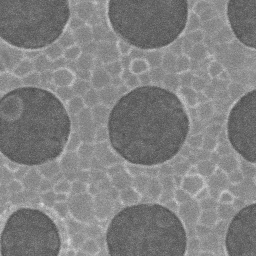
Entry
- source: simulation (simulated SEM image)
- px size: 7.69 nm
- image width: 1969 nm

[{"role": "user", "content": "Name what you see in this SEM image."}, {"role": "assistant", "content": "holes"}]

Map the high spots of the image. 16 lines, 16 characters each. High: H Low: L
LLLLHHHLLLLLHHLL
LLLLHHHLLLLLHHLL
LLLHHHHHLLLHHHHL
HHHHHHHHHHHHHHHH
HHHHHHHHHHHHHHHH
HLHHHHHHHLHHHHHH
LLLLHHHLLLLHHHHL
LLLLHHHLLLLLHHLL
LLLLHHHLLLLLHHLL
LLLLHHHLLLLHHHHL
HHHHHHHHHHHHHHHH
HHHHHHHHHHHHHHHH
HHHHHHHHHHHHHHHH
HLLHHHHLLLLHHHHL
LLLLHHHLLLLLHHLL
LLLLHHHLLLLLHHLL